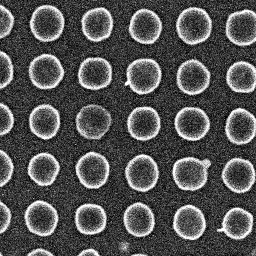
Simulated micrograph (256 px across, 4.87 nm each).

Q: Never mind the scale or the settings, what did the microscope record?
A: a regular array of raised bodies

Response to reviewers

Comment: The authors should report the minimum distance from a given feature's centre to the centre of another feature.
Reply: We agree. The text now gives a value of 234 nanometers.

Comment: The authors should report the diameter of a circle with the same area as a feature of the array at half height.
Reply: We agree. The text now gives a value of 159 nanometers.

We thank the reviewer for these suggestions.